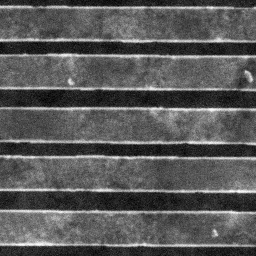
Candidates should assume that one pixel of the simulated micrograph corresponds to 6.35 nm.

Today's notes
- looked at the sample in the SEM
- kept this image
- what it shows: lines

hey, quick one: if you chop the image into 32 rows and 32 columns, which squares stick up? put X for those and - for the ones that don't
--------------------------------
XXXXXXXXXXXXXXXXXXXXXXXXXXXXXXXX
XXXXXXXXXXXXXXXXXXXXXXXXXXXXXXXX
XXXXXXXXXXXXXXXXXXXXXXXXXXXXXXXX
XXXXXXXXXXXXXXXXXXXXXXXXXXXXXXXX
--------------------------------
--------------------------------
XXXXXXXXXXXXXXXXXXXXXXXXXXXXXXXX
XXXXXXXXXXXXXXXXXXXXXXXXXXXXXXXX
XXXXXXXXXXXXXXXXXXXXXXXXXXXXXXXX
XXXXXXXXXXXXXXXXXXXXXXXXXXXXXXXX
--------------------------------
--------------------------------
--------------------------------
XXXXXXXXXXXXXXXXXXXXXXXXXXXXXXXX
XXXXXXXXXXXXXXXXXXXXXXXXXXXXXXXX
XXXXXXXXXXXXXXXXXXXXXXXXXXXXXXXX
XXXXXXXXXXXXXXXXXXXXXXXXXXXXXXXX
--------------------------------
--------------------------------
XXXXXXXXXXXXXXXXXXXXXXXXXXXXXXXX
XXXXXXXXXXXXXXXXXXXXXXXXXXXXXXXX
XXXXXXXXXXXXXXXXXXXXXXXXXXXXXXXX
XXXXXXXXXXXXXXXXXXXXXXXXXXXXXXXX
--------------------------------
--------------------------------
XXXXXXXXXXXXXX-XXXXXXXXX-XX-----
XXXXXXXXXXXXXXXXXXXXXXXXXXXXXXXX
XXXXXXXXXXXXXXXXXXXXXXXXXXXXXXXX
XXXXXXXXXXXXXXXXXXXXXXXXXXXXXXXX
XXXXXXXXXXXXXXXXXXXXXXXXXXXXXXXX
--------------------------------